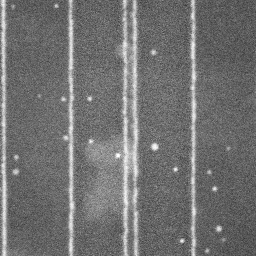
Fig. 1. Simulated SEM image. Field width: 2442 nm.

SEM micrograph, lines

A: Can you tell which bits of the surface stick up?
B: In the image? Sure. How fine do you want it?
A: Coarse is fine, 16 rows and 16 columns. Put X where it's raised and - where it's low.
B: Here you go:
XXXX--------XXXX
XXXX--------XXXX
XXXX--------XXXX
XXXX--------XXXX
XXXX--------XXXX
XXXX--------XXXX
XXXX--------XXXX
XXXX--------XXXX
XXXX--------XXXX
XXXX--------XXXX
XXXX--------XXXX
XXXX--------XXXX
XXXX--------XXXX
XXXX--------XXXX
XXXX--------XXXX
XXXX--------XXXX